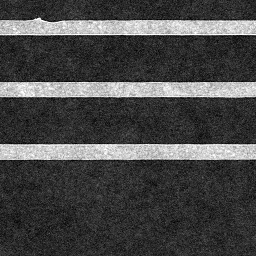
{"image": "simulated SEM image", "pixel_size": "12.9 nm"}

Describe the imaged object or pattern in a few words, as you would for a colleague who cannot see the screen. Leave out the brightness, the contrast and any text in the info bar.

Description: one or a few lines or trenches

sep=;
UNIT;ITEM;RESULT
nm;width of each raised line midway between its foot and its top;188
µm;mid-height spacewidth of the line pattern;0.618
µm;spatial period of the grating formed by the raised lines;0.802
